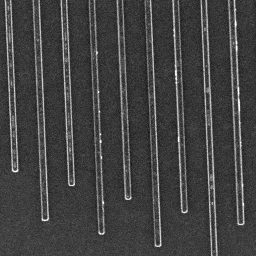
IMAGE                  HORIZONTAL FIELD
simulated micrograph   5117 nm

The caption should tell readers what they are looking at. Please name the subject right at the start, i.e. parallel lines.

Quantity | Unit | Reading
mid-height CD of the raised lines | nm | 112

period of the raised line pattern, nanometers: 558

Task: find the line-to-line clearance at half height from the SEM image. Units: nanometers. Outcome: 452